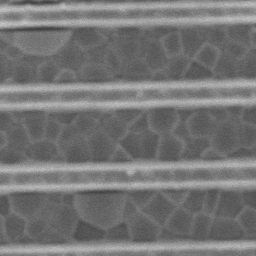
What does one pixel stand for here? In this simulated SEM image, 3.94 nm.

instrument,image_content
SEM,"one or a few lines or trenches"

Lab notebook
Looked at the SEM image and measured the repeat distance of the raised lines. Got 320 nm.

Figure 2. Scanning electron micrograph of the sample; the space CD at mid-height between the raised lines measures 0.233 microns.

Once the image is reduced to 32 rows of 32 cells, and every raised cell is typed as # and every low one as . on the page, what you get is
......................##########
################################
################################
................................
................................
................................
................................
................................
................................
................................
...................#############
################################
################################
##..............................
................................
................................
................................
................................
................................
................................
.....................###########
################################
################################
##############..................
................................
................................
................................
................................
................................
................................
............................####
################################